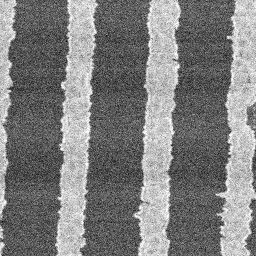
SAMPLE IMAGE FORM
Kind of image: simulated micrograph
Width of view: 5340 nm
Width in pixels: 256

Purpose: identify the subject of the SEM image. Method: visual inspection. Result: one or a few lines or trenches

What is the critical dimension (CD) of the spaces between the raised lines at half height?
57.9 pixels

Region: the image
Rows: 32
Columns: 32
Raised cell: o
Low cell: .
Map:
oo.......ooo.......ooo........oo
oo.......oo........ooo........oo
oo.......ooo.......ooo.......ooo
o.........oo.......ooo.......ooo
oo.......ooo.......ooo.......ooo
o........ooo.......ooo.......ooo
o........ooo.......ooo.........o
o........oo........ooo.......o.o
o.......ooo........ooo.......ooo
o.......ooo.......oooo.......oo.
o.......ooo.......oooo.......oo.
o.......ooo........ooo.......ooo
o.......ooo........ooo......oooo
o.......ooo.......oooo......ooo.
o.......ooo.......ooo........oo.
.........oo.......ooo........oo.
o.......ooo.......ooo........ooo
o.......ooo.......ooo........ooo
........ooo.......ooo........ooo
o.......ooo.......ooo........oo.
o.......ooo.......ooo........oo.
o.......ooo.......ooo........oo.
o.......ooo.......ooo........oo.
o.......ooo.......ooo.......oooo
........oo........ooo.......oooo
........ooo.......ooo.......ooo.
........oo.......oooo.......ooo.
.......ooo........ooo.......ooo.
.......ooo........ooo.......ooo.
.......ooo........ooo.......ooo.
.......ooo........ooo.......ooo.
.......ooo........o.o.......ooo.